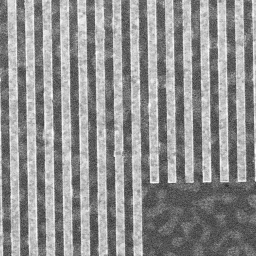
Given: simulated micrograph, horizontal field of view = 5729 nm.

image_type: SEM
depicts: parallel lines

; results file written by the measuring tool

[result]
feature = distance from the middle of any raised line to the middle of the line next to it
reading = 391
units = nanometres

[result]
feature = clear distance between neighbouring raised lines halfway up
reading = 215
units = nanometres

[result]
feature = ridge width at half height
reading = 173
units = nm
